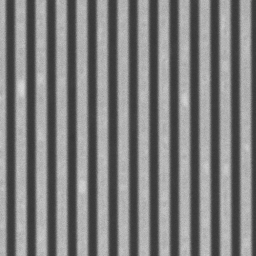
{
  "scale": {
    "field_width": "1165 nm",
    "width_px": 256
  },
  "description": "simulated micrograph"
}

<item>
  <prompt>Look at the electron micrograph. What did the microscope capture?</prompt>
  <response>parallel lines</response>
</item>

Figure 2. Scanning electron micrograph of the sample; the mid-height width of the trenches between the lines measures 39.9 nm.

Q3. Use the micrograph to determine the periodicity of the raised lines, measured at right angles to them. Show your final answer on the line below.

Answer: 20.4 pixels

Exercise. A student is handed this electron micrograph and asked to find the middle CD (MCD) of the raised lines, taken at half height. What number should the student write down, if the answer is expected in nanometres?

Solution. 51.8